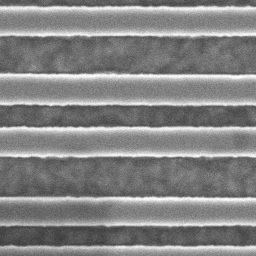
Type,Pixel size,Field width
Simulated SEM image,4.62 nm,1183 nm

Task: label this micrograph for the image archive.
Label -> lines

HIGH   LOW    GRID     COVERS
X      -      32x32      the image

--------------------------------
XXXXXXXXXXXXXXXXXXXXXXXXXXXXXXXX
XXXXXXXXXXXXXXXXXXXXXXXXXXXXXXXX
XXXXXXXXXXXXXXXXXXXXXXXXXXXXXXXX
----XX-----X-------XX--XX--XX-X-
--------------------------------
--------------------------------
--------------------------------
--------------------------------
XXXXXXXXXXXXXXXXXXXXXXXXXXXXX-XX
XXXXXXXXXXXXXXXXXXXXXXXXXXXXXXXX
XXXXXXXXXXXXXXXXXXXXXXXXXXXXXXXX
XXXXXXXXXXXXXXXXXXXXXXXXXXXXXXXX
--------------------------------
--------------------------------
--------------------------------
XXXXXXXXXXXXXXXXXXXXXXXXXXXXXXXX
XXXXXXXXXXXXXXXXXXXXXXXXXXXXXXXX
XXXXXXXXXXXXXXXXXXXXXXXXXXXXXXXX
-XXXXX-XXXXX----X--XXXXXX-X--X-X
--------------------------------
--------------------------------
--------------------------------
--------------------------------
--------------------------------
XXXXXXXXXXXXXXXXXXXXXXXXXXXXXXXX
XXXXXXXXXXXXXXXXXXXXXXXXXXXXXXXX
XXXXXXXXXXXXXXXXXXXXXXXXXXXXXXXX
--------------------------------
--------------------------------
--------------------------------
XXXXXXXXXXXXXXXXXXXXXXXXXXXXXXXX